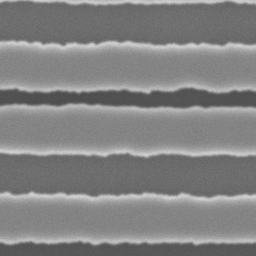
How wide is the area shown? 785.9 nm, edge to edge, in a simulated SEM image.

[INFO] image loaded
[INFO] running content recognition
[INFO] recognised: lines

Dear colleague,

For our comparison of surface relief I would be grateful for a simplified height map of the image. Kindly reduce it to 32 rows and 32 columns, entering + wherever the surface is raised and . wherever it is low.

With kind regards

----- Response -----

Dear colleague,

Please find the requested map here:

................................
................................
................................
................................
................................
+++++....+.+++++++.......+......
++++++++++++++++++++++++++++++++
++++++++++++++++++++++++++++++++
++++++++++++++++++++++++++++++++
++++++++++++++++++++++++++++++++
++++++++++++++++++++++++++++++++
..................+........+....
................................
++++++++++++++++++.+++..+.++++++
++++++++++++++++++++++++++++++++
++++++++++++++++++++++++++++++++
++++++++++++++++++++++++++++++++
++++++++++++++++++++++++++++++++
++++++++++++++++++++++++++++++++
................................
................................
................................
................................
................................
+++++++++++..++++++++.++......++
++++++++++++++++++++++++++++++++
++++++++++++++++++++++++++++++++
++++++++++++++++++++++++++++++++
++++++++++++++++++++++++++++++++
++++++++++++++++++++++++++++++++
................................
................................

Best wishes